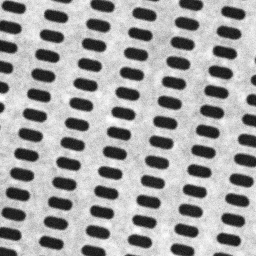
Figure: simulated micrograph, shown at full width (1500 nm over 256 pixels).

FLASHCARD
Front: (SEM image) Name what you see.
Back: a regular array of holes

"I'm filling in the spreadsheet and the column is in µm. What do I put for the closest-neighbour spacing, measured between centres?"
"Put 0.118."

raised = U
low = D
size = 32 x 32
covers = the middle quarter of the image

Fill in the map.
UUUDDDDDDDUUUUUUUUUUUUUUUUDDDDDD
UUUUUDDDDUUUUUDDDDDUUUUUUUUUUDDU
UUUUUUUUUUUUUUDDDDDDUUUUUUUUUUUU
UUUDDUUUUUUUUUUDDDDDUUUUUDDDDUUU
UUDDDDDDUUUUUUUUUUUUUUUUDDDDDDDU
UUDDDDDDDUUUUUUUUUUUUUUUUDDDDDDU
UUUUDDDDUUUUUDDDDDUUUUUUUUUUDDUU
UUUUUUUUUUUUUDDDDDDUUUUUUUUUUUUU
UUDDUUUUUUUUUUDDDDDUUUUDDDDDUUUU
UDDDDDDUUUUUUUUUUUUUUUUDDDDDDUUU
UDDDDDDDUUUUUDUUUUUUUUUUDDDDDDUU
UUUUDDDUUUUUDDDDDUUUUUUUUUUDDUUU
UUUUUUUUUUUUDDDDDDUUUUUUUUUUUUUU
UDDUUUUUUUUUUDDDDDUUUUDDDDDUUUUU
DDDDDDUUUUUUUUUUUUUUUUDDDDDDUUUU
DDDDDDUUUUUUUUUUUUUUUUUDDDDDUUUU
UUDDDDUUUUUDDDDDUUUUUUUUUUDUUUUU
UUUUUUUUUUUDDDDDDUUUUUUUUUUUUUUU
DDDUUUUUUUUUDDDDDUUUUDDDDDUUUUUU
DDDDDUUUUUUUUUUUUUUUUDDDDDDUUUUU
DDDDDUUUUUUDUUUUUUUUUUDDDDDUUUUU
UUDDDUUUUUDDDDDUUUUUUUUUUUUUUUUU
UUUUUUUUUUDDDDDDUUUUUUUUUUUUUUUU
DDUUUUUUUUUDDDDDUUUUDDDDDUUUUUUU
DDDDUUUUUUUUUUUUUUUUDDDDDDUUUUUU
DDDDUUUUUDDUUUUUUUUUUDDDDDUUUUUD
UDDDUUUUDDDDDDUUUUUUUUUUUUUUUUUD
UUUUUUUUUDDDDDDUUUUUUUUUUUUUUUUD
DUUUUUUUUUDDDDDUUUUDDDDDUUUUUUUU
DDDUUUUUUUUUUUUUUUUDDDDDDUUUUUUU
DDDUUUUUDDUUUUUUUUUUDDDDDUUUUUDD
DDDUUUUDDDDDDUUUUUUUUUUUUUUUUUDD